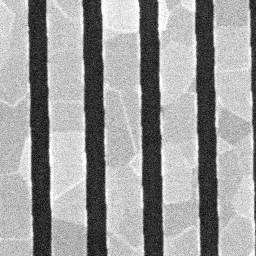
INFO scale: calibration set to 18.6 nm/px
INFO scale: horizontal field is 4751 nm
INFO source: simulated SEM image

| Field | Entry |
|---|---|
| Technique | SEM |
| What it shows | lines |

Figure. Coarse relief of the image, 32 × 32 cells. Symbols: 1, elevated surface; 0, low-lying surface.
11100011110001111000111100011110
11100011110001111000111100011110
11100011110001111000111100011110
11100011110001111000111100011110
11110011110001111000111100011110
11110011110001111000111100011110
11110011110001111000111100011110
11110011110001111000111100011110
11110011110001111000111100011110
11110011110001111000111100011110
11110011110001111000111100011110
11110011110001111100111100011110
11110011110001111100111110011110
11110011110001111100111110011110
11110011111001111100111110011110
11110011111001111100111110011110
11110011111001111100111110011111
11110011111001111100111110011111
11110011111001111100111110011111
11110011111001111100111110011111
11110011111001111100111110011111
11110011111001111100111110011111
11110011111001111100111110011111
11110011111001111100111110011111
11110011111001111100111110011111
11110011111001111100111110011111
11110001111001111100111110011111
11110001111001111100011110011111
11110001111001111100011110011111
11110001111001111100011110011111
11110001111001111100011110011111
11110001111000111100011110011111